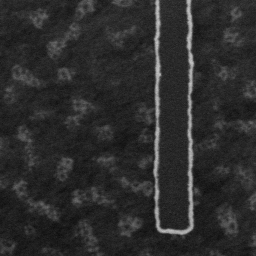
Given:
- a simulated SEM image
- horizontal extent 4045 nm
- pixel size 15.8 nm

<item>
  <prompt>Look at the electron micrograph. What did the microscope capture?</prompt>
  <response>one or a few lines or trenches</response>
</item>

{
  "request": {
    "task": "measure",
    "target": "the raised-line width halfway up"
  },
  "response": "531 nanometers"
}